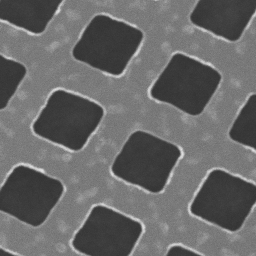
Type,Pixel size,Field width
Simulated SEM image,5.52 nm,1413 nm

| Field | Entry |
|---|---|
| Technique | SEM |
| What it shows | holes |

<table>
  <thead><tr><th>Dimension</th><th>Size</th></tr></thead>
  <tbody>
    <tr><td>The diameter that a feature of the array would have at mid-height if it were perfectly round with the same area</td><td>328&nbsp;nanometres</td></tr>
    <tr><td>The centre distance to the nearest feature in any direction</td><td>474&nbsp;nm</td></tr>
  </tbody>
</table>